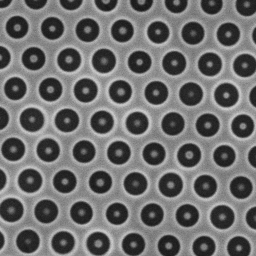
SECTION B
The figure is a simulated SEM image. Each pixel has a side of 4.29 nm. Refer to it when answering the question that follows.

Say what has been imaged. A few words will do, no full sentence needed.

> an array of small figures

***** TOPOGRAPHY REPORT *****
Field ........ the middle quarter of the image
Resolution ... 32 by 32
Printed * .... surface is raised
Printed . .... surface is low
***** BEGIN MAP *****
....***......***......***......*
...*****....*****....****.....**
*********..***************...***
****..**************************
***.....****....******..*******.
**.......**......***......****..
**...*...**...*..***......***...
**......***...*..***......***...
***.....***......***......***...
****...*****....*****....****...
*******************************.
..*******..*******.*************
...****.....****....******...***
....***......**......****.....**
....**...*...**.......**......**
....***......**......***......**
...****.....***......****.....**
********...*****....******...***
********************************
***....*****...*****************
***.....***.....****.....****...
**......***......***.....***....
**......***..*...**...*...**...*
**......***.....****.....***...*
****...*****....****.....***....
**********************.******...
.*******************************
..*****....*****....*****....***
...***......***......***......**
*..***..**..***......**.......**
...***......***......**...*...**
..*****....****......***......**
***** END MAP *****